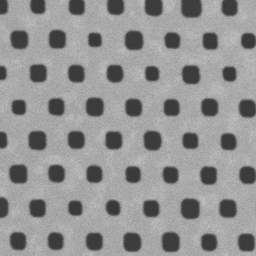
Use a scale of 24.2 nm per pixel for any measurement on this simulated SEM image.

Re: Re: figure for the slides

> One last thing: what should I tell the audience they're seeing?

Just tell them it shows a regular array of holes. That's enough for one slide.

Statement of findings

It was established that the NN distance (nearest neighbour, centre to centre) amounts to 0.903 µm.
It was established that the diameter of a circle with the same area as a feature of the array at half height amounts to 439 nm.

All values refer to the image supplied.